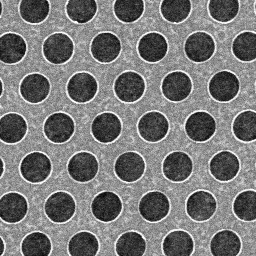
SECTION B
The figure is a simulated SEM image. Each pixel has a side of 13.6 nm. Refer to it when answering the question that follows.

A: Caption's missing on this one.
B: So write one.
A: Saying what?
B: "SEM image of a regular array of holes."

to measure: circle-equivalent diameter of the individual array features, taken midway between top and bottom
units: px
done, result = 30.6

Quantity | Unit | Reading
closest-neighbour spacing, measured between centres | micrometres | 0.625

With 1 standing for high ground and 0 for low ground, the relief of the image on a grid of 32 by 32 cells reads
11000011000011000011000011000011
11000011000011000011000011000011
11100111100111100111100111100111
11111111111111111111111111111111
00011100111100011100111100111100
00011000011000011000011000011000
00011000011000011000011000011000
00011100111100111100111100111100
11111111111111111111111111111111
11100111100011100011100111100111
11100011000011000011000011000011
11100011000011000011000011000011
11100111100111100111100111100111
11111111111111111111111111111111
00011100011100011100111100111100
00011100011000011000011000011000
00011100011000011000011000011000
00011100111100111100111100111100
11111111111111111111111111111111
11100011100011100011100011100011
11100011000011000011000011000011
11100011000011000011000011000011
11100011100111100111100111100111
11111111111111111111111111111111
00011100011100011100011100011100
00011100011000011000011000011000
00011100011000011100011000011000
00011100011100111100111100111100
11111111111111111111111111111111
11100011100011100011100011100011
11100011100011100011000011000011
11100011100011100011000011000011